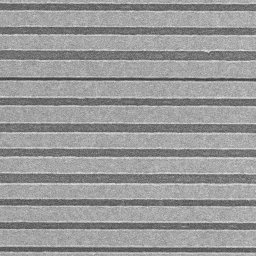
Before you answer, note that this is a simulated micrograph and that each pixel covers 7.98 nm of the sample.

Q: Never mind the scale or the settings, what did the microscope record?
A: parallel lines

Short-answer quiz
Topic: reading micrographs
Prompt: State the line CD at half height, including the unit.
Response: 132 nm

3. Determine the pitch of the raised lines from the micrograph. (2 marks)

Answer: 194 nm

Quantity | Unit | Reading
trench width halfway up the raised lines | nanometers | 68.8